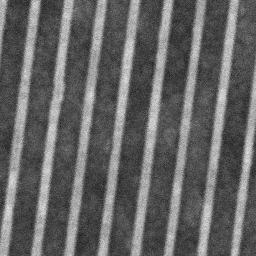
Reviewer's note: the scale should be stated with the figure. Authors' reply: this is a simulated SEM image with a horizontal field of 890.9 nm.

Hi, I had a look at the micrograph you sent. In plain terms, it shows parallel lines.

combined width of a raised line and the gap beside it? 0.114 µm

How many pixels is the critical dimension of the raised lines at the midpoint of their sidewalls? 6.44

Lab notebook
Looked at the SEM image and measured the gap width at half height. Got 92.3 nm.